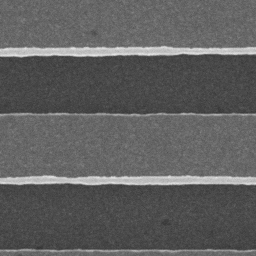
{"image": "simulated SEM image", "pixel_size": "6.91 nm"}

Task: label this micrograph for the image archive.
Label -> lines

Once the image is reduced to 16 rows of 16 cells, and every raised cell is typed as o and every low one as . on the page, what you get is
oooooooooooooooo
oooooooooooooooo
oooooooooooooooo
.o..............
................
................
................
oooooooooooooooo
oooooooooooooooo
oooooooooooooooo
oooooooooooooooo
.....o..oooo...o
................
................
................
................